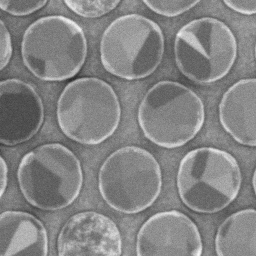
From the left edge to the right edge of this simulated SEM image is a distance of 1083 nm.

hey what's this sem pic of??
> a regular array of raised bodies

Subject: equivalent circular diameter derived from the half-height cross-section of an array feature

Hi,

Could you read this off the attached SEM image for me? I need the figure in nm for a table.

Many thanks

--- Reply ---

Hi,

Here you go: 271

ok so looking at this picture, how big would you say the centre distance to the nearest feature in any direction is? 309 nanometres